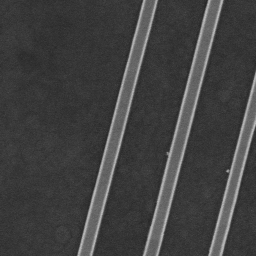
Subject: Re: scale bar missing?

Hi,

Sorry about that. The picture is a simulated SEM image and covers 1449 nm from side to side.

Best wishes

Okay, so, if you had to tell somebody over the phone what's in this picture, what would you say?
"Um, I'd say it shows one or a few lines or trenches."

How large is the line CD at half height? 12.5 px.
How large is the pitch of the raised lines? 0.358 microns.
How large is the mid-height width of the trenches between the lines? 289 nm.